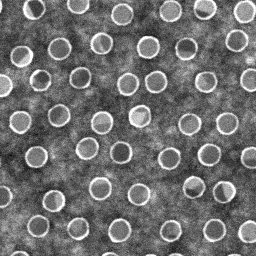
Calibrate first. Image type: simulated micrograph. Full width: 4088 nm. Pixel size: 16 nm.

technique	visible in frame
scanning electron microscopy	a regular array of raised bodies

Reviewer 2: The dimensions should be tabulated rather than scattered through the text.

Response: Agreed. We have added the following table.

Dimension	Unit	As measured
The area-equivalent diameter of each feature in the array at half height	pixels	21.2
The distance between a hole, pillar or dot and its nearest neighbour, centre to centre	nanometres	574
